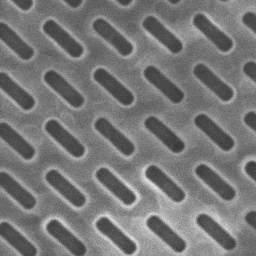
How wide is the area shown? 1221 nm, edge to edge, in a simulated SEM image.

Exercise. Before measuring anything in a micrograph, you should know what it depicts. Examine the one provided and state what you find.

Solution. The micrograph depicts a regular array of holes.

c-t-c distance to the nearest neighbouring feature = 236 nm